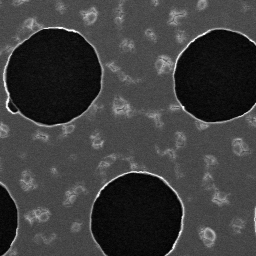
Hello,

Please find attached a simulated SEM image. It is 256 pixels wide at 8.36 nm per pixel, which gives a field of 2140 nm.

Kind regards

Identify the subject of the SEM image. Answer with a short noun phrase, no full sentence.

holes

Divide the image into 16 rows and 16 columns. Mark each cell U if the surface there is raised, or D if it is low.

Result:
UUUUUUUUUUUUUUUU
UUUUUUUUUUUUUUUU
UUDDDUUUUUUUDDDD
UDDDDDUUUUUDDDDD
DDDDDDUUUUUDDDDD
DDDDDDUUUUUDDDDD
UDDDDDUUUUUDDDDD
UUDDUUUUUUUUUDUU
UUUUUUUUUUUUUUUU
UUUUUUUUUUUUUUUU
UUUUUUUUUUUUUUUU
UUUUUUUDDDUUUUUU
DUUUUUDDDDDUUUUU
DUUUUUDDDDDUUUUU
DUUUUUDDDDDUUUUU
DUUUUUDDDDDUUUUU